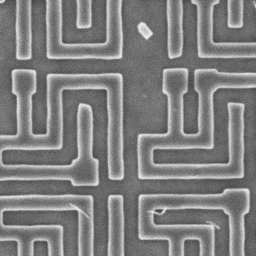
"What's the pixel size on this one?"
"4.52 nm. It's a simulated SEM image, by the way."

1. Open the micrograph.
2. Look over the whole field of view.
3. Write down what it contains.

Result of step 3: wiring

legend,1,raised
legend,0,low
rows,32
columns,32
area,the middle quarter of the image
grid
00000000000000000000000000000000
00000000000000000000000001111110
00000000011111000000000001111110
11111111111111100000000001111110
11111111111111100000000001111110
11111111111111100000000001111110
00000000000111100000000001111110
00000000000111100000000001111100
00000000000111100000000000111100
00000000000111100000000000111100
00001100000111100000000000111100
00001110000111100000000000111100
00011110000111100000000000111100
00011110000111100000000000111100
00011110000111100000000000111100
00011110000111100000000000111100
00011110000111100000000000111100
00011110000111100000000001111110
00011110000111100011111111111111
00011110000111100011111111111111
00011110000111100011111111111111
00001110000111100011110000000000
00001110000111100011110000000000
00011110000111100011110000000000
00111111000111100001110000000000
11111111000111100001111111111111
11111111000111100001111111111111
11111111000111100001111111111111
11111111000111100001111111111111
00111111100000000000000000000000
00000000000000000000000000000000
00000000000000000000000000000000